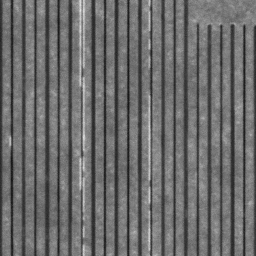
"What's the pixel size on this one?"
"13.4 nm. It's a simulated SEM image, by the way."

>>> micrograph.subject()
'parallel lines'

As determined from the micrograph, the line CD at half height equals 112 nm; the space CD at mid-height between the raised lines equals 0.0487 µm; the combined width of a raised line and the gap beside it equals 155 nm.